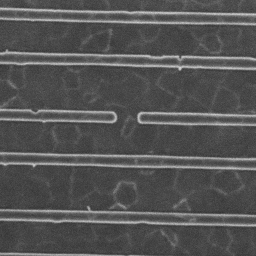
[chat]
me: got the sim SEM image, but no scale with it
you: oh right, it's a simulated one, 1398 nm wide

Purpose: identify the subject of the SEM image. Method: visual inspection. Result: parallel lines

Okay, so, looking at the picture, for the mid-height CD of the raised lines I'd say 57.4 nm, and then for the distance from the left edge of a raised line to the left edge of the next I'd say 274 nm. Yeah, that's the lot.